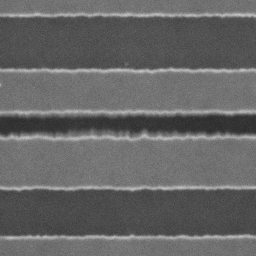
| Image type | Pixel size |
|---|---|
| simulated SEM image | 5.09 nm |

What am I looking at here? lines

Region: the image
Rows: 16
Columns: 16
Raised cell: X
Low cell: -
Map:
XXXXXXXXXXXXXXXX
----------------
----------------
----------------
XXXXXXXXXXXXXXXX
XXXXXXXXXXXXXXXX
XXXXXXXXXXXXXXXX
----------------
----------------
XXXXXXXXXXXXXXXX
XXXXXXXXXXXXXXXX
XXXXXXXXXXXXXXXX
----------------
----------------
----------------
XXXXXXXXXXXXXXXX